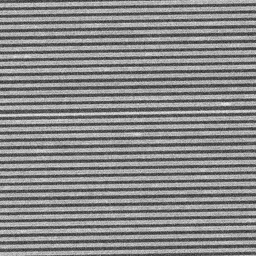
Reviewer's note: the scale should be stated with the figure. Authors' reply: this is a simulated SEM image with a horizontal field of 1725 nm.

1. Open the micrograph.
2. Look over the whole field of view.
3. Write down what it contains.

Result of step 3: parallel lines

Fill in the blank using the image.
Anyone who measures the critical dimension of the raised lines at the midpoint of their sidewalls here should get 26.1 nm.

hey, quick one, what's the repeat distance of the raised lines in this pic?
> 0.0493 micrometres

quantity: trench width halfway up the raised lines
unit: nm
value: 22.8